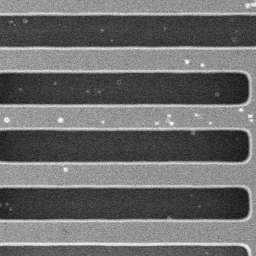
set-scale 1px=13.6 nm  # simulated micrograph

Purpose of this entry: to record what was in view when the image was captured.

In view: groups of lines, slits or small figures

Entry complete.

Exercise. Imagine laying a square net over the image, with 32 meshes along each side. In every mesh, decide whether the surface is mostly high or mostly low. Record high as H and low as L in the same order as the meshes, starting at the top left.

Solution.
HHHHHHHHHHHHHHHHHHHHHHHHHHHHHHHH
HHHHHHHHHHHHHHHHHHHHHHHHHHHHHHHH
LLLLLLLLLLLLLLLLLLLLLLLLLLLLLLLL
LLLLLLLLLLLLLLLLLLLLLLLLLLLLLLLL
LLLLLLLLLLLLLLLLLLLLLLLLLLLLLLLL
LLLLLLLLLLLLLLLLLLLLLLLLLLLLLLLL
HHHHHHHHHHHHHHHHHHHHHHHHHHHHHHHH
HHHHHHHHHHHHHHHHHHHHHHHHHHHHHHHH
HHHHHHHHHHHHHHHHHHHHHHHHHHHHHHHH
LLLLLLLLLLLLLLLLLLLLLLLLLLLLLLLH
LLLLLLLLLLLLLLLLLLLLLLLLLLLLLLLH
LLLLLLLLLLLLLLLLLLLLLLLLLLLLLLLH
LLLLLLLLLLLLLLLLLLLLLLLLLLLLLLLH
HHHHHHHHHHHHHHHHHHHHHHHHHHHHHHHH
HHHHHHHHHHHHHHHHHHHHHHHHHHHHHHHH
HHHHHHHHHHHHHHHHHHHHHHHHHHHHHHHH
LLLLLLLLLLLLLLLLLLLLLLLLLLLLLLLH
LLLLLLLLLLLLLLLLLLLLLLLLLLLLLLLH
LLLLLLLLLLLLLLLLLLLLLLLLLLLLLLLH
LLLLLLLLLLLLLLLLLLLLLLLLLLLLLLLH
HHHHHHHHHHHHHHHHHHHHHHHHHHHHHHHH
HHHHHHHHHHHHHHHHHHHHHHHHHHHHHHHH
HHHHHHHHHHHHHHHHHHHHHHHHHHHHHHHH
LLLLLLLLLLLLLLLLLLLLLLLLLLLLLLHH
LLLLLLLLLLLLLLLLLLLLLLLLLLLLLLLH
LLLLLLLLLLLLLLLLLLLLLLLLLLLLLLLH
LLLLLLLLLLLLLLLLLLLLLLLLLLLLLLLH
LLLLLLLLLLLLLLLLLLLLLLLLLLLLLLHH
HHHHHHHHHHHHHHHHHHHHHHHHHHHHHHHH
HHHHHHHHHHHHHHHHHHHHHHHHHHHHHHHH
HHHHHHHHHHHHHHHHHHHHHHHHHHHHHHHH
LLLLLLLLLLLLLLLLLLLLLLLLLLLLLLLH